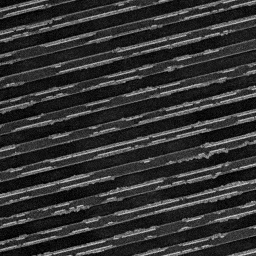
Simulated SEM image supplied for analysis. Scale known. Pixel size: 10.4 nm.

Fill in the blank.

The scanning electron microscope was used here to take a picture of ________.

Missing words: parallel lines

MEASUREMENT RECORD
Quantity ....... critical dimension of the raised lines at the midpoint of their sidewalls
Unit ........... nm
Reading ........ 108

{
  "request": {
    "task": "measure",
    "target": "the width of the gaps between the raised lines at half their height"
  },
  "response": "0.127 µm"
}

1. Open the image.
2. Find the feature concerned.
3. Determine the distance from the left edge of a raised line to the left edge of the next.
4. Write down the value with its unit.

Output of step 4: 236 nanometres